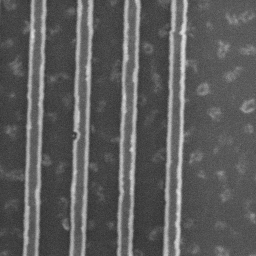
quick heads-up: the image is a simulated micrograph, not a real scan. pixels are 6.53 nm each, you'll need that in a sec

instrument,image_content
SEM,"parallel lines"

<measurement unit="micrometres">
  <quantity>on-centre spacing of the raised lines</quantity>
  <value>0.306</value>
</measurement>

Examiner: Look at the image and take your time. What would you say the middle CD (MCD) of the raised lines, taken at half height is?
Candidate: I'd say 80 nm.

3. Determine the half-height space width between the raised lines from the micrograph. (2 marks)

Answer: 0.222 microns